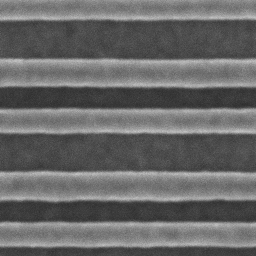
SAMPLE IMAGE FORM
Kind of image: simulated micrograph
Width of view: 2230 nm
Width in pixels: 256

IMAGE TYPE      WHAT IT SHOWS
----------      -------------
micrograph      lines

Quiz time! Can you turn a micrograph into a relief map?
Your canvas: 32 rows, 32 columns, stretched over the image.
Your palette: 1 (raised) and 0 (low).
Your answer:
11111111111111111111111111111111
11111111111111111111111111111111
00000000000000000000000000000000
00000000000000000000000000000000
00000000000000000000000000000000
00000000000000000000000000000000
00000000000000000000000000000000
11100000000001000000000000000000
11111111111111111111111111111111
11111111111111111111111111111111
11111111111111111111111111111111
00000000000000000000000000000000
00000000000000000000000000000000
00000000000000000000000000000000
11111111111111111111111111111111
11111111111111111111111111111111
00000011100000000000011000000001
00000000000000000000000000000000
00000000000000000000000000000000
00000000000000000000000000000000
00000000000000000000000000000000
00000000000000000000000000000000
11111111111111111111111111111111
11111111111111111111111111111111
11111111111111111111111111111111
00000000000000000000000000000000
00000000000000000000000000000000
00000000000000000000000000000000
11111111111111111111111111111111
11111111111111111111111111111111
11111111111111111111111111111111
00000000000000000000000000000000